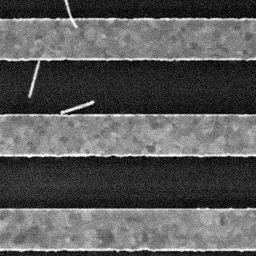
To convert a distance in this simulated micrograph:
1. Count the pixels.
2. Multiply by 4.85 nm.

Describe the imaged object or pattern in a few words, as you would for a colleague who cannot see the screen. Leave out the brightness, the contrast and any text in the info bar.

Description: lines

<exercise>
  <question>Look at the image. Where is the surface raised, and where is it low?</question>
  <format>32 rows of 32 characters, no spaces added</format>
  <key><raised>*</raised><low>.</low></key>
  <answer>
................................
................................
********************************
********************************
********************************
********************************
********************************
.***................***.......*.
................................
................................
................................
................................
................................
................................
********************************
********************************
********************************
********************************
********************************
...*...*........................
................................
................................
................................
................................
................................
................................
********************************
********************************
********************************
********************************
********************************
................................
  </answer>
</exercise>